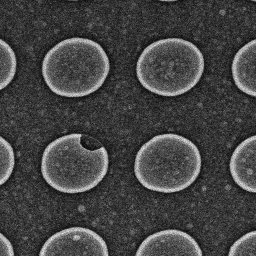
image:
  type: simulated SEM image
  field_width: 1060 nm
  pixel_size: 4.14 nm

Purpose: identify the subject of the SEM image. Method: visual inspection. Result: raised bodies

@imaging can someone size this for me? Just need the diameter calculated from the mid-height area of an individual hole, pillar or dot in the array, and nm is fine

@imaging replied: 246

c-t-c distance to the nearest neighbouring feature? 391 nm